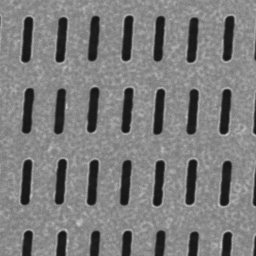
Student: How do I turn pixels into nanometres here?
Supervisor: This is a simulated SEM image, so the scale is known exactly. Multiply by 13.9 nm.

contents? a regular array of holes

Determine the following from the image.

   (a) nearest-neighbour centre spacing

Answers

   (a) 0.453 um